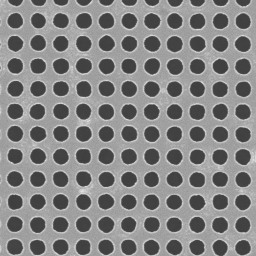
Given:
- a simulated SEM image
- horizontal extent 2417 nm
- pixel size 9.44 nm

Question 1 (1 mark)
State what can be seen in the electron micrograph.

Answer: a regular array of holes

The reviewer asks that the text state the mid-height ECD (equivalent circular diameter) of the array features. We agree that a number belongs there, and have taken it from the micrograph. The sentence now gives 15.7 px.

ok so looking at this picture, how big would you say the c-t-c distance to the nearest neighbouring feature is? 0.212 um